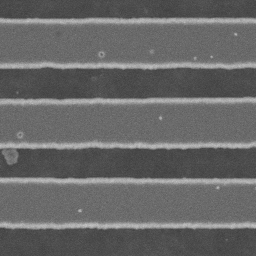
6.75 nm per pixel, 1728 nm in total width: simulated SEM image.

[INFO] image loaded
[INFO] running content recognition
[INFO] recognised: lines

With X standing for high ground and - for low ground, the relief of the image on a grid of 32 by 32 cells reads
--------------------------------
--------------------------------
XXXXXXXXXXXXXXXXXXXXXXXXXXXXXXXX
XXXXXXXXXXXXXXXXXXXXXXXXXXXXXXXX
XXXXXXXXXXXXXXXXXXXXXXXXXXXXXXXX
XXXXXXXXXXXXXXXXXXXXXXXXXXXXXXXX
XXXXXXXXXXXXXXXXXXXXXXXXXXXXXXXX
XXXXXXXXXXXXXXXXXXXXXXXXXXXXXXXX
XXXX---XX-XXXXXXXXXXX----XXXXXX-
--------------------------------
--------------------------------
--------------------------------
-----X---XXXXXXXXXXXXXXXXXXXXXXX
XXXXXXXXXXXXXXXXXXXXXXXXXXXXXXXX
XXXXXXXXXXXXXXXXXXXXXXXXXXXXXXXX
XXXXXXXXXXXXXXXXXXXXXXXXXXXXXXXX
XXXXXXXXXXXXXXXXXXXXXXXXXXXXXXXX
XXXXXXXXXXXXXXXXXXXXXXXXXXXXXXXX
XXXXXXXXXXX----XXXXXXXXXX---XXX-
--------------------------------
--------------------------------
--------------------------------
XXXXXXXXXXXXXXXXXXXXXXXXXXXXXXXX
XXXXXXXXXXXXXXXXXXXXXXXXXXXXXXXX
XXXXXXXXXXXXXXXXXXXXXXXXXXXXXXXX
XXXXXXXXXXXXXXXXXXXXXXXXXXXXXXXX
XXXXXXXXXXXXXXXXXXXXXXXXXXXXXXXX
XXXXXXXXXXXXXXXXXXXXXXXXXXXXXXXX
-------X------------------------
--------------------------------
--------------------------------
--------------------------------